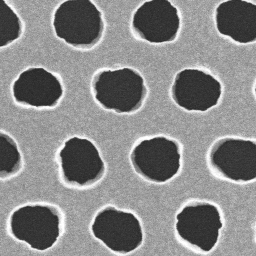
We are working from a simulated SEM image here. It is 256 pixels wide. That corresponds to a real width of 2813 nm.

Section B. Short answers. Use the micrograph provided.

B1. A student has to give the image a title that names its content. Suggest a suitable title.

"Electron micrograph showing a regular array of holes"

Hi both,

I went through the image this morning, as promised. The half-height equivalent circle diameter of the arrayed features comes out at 0.501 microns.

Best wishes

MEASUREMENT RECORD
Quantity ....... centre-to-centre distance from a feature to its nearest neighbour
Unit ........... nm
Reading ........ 843